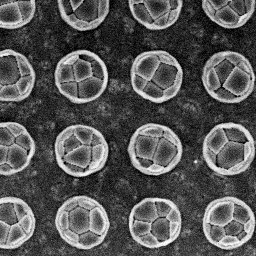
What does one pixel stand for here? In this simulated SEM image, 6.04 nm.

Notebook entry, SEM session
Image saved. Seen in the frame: a regular array of raised bodies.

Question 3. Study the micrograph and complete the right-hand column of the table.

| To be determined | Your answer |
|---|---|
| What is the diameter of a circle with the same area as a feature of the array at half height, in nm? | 274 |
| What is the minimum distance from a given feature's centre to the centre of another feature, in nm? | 431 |